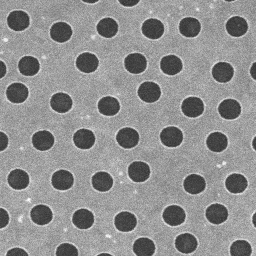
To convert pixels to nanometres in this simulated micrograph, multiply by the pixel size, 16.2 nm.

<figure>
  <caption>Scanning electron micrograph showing a regular array of holes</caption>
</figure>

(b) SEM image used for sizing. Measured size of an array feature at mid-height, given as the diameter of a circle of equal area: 366 nm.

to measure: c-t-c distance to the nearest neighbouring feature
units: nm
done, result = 602